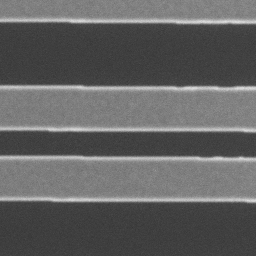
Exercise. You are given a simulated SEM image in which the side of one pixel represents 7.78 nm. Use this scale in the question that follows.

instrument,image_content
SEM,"lines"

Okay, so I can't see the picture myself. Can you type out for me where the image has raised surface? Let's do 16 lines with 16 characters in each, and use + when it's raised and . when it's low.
++++++++++++++++
................
................
................
................
++++++++++++++++
++++++++++++++++
++++++++++++++++
................
................
++++++++++++++++
++++++++++++++++
...+++++++++++++
................
................
................